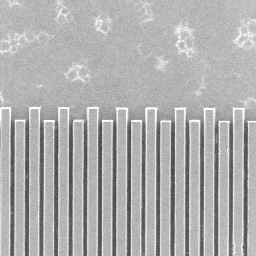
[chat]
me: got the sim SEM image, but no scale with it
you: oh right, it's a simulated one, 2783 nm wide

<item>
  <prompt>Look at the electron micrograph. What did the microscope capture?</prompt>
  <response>parallel lines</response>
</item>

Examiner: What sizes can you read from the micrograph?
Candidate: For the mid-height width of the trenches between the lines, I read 47.5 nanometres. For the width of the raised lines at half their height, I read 105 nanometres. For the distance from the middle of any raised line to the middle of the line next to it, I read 158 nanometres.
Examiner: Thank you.